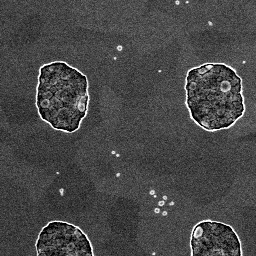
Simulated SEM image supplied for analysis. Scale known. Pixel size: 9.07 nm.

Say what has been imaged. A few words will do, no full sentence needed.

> holes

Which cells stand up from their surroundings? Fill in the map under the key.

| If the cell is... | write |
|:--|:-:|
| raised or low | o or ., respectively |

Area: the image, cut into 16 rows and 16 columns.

oooooooooooooooo
oooooooooooooooo
oooooooooooooooo
oooooooooooooooo
ooo..ooooooo...o
oo...ooooooo...o
oo...ooooooo...o
ooo..ooooooo...o
oooooooooooooooo
oooooooooooooooo
oooooooooooooooo
oooooooooooooooo
oooooooooooooooo
oooooooooooooooo
ooo..ooooooo...o
oo....oooooo...o